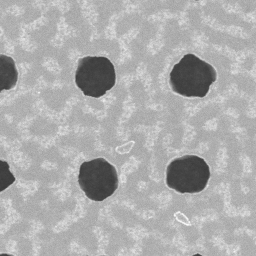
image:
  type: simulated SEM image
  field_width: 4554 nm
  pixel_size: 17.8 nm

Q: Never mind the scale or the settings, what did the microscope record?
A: holes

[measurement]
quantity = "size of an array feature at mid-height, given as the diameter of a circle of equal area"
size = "0.728 micrometres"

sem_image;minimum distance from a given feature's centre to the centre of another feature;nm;1660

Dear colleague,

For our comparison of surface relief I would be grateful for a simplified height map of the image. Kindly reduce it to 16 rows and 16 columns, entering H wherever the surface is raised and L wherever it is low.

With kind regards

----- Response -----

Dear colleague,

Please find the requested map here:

HHHHHHHHHHHHHHHH
HHHHHHHHHHHHHHHH
HHHHHHHHHHHHHHHH
HHHHHHHHHHHHHHHH
LHHHHLLHHHHLLHHH
LHHHHLLHHHHLLHHH
HHHHHHHHHHHHHHHH
HHHHHHHHHHHHHHHH
HHHHHHHHHHHHHHHH
HHHHHHHHHHHHHHHH
LHHHHLLHHHHLLHHH
LHHHHLLHHHHLLHHH
HHHHHHHHHHHHHHHH
HHHHHHHHHHHHHHHH
HHHHHHHHHHHHHHHH
HHHHHHHHHHHHHHHH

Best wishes